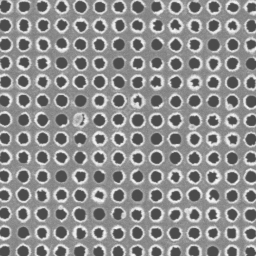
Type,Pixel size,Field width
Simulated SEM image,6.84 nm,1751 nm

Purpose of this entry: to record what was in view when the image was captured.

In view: a regular array of holes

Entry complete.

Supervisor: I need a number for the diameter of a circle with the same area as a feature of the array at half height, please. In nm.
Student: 73.6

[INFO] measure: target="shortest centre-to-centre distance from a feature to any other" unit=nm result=126